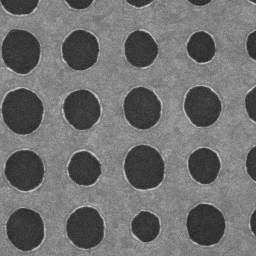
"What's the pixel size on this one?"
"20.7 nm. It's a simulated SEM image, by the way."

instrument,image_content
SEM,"a regular array of holes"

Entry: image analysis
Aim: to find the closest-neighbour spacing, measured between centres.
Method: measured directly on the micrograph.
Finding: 1220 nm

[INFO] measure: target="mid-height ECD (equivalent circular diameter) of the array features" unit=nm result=837